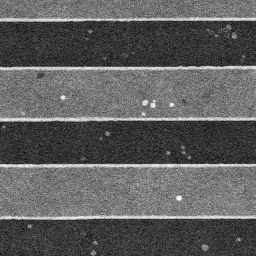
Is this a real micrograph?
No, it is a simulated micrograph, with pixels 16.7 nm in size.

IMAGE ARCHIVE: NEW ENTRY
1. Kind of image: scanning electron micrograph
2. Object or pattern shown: lines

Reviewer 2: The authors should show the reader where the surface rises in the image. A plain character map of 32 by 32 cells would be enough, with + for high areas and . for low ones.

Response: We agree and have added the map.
++++++++++++++++++++++++++++++++
++++++++++++++++++++++++++++++++
++++++++++++++++++++++++++++++++
................................
................................
................................
................................
................................
++++++++++++++++++++++++++++++++
++++++++++++++++++++++++++++++++
++++++++++++++++++++++++++++++++
++++++++++++++++++++++++++++++++
++++++++++++++++++++++++++++++++
++++++++++++++++++++++++++++++++
++++++++++++++++++++++++++++++++
................................
................................
................................
................................
................................
................................
++++++++++++++++++++++++++++++++
++++++++++++++++++++++++++++++++
++++++++++++++++++++++++++++++++
++++++++++++++++++++++++++++++++
++++++++++++++++++++++++++++++++
++++++++++++++++++++++++++++++++
................................
................................
................................
................................
................................